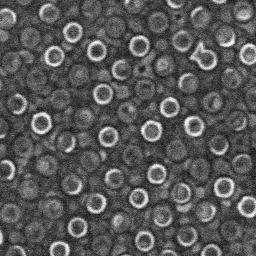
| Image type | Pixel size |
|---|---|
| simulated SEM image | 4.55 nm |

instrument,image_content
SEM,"a regular array of raised bodies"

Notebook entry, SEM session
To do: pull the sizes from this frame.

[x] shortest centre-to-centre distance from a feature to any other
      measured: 136 nm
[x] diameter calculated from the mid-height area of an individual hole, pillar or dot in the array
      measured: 87.5 nm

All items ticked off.